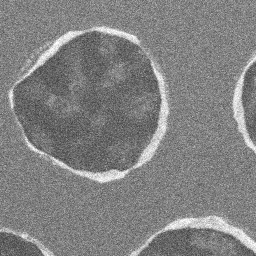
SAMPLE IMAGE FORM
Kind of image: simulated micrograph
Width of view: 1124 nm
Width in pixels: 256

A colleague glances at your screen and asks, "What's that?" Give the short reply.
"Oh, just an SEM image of holes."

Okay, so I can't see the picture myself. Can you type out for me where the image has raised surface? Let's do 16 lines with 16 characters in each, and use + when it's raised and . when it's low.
++++++++++++++++
++++++++++++++++
++++....++++++++
+++......+++++++
++........+++++.
+.........+++++.
+.........+++++.
+.........+++++.
++........+++++.
+++......+++++++
++++....++++++++
++++++++++++++++
++++++++++++++++
++++++++++++++++
++++++++++....++
..+++++++.......